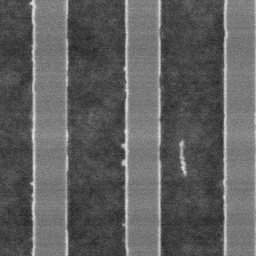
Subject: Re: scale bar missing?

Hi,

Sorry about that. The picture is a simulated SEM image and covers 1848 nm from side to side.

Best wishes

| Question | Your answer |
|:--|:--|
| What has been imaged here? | lines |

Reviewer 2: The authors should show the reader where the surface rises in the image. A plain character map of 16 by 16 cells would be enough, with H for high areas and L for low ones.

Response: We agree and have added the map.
LLHHLLLLHHLLLLHH
LLHHLLLLHHLLLLHH
LLHHLLLLHHLLLLHH
LLHHLLLLHHLLLLHH
LLHHLLLLHHLLLLHH
LLHHLLLLHHLLLLHH
LLHHLLLLHHLLLLHH
LLHHLLLLHHLLLLHH
LLHHLLLLHHLLLLHH
LLHHLLLLHHLLLLHH
LLHHLLLLHHLLLLHH
LLHHLLLLHHLLLLHH
LLHHLLLLHHLLLLHH
LLHHLLLLHHLLLLHH
LLHHLLLLHHLLLLHH
LLHHLLLLHHLLLLHH